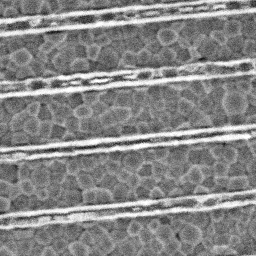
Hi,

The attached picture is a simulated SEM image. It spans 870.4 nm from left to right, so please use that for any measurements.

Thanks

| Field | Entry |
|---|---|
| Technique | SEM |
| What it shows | one or a few lines or trenches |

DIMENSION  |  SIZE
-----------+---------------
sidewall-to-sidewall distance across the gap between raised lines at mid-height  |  173 nm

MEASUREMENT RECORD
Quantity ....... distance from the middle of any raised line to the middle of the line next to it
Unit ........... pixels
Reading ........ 64.6